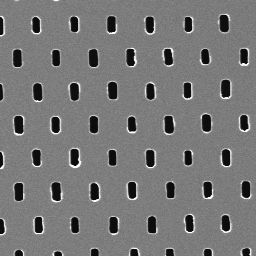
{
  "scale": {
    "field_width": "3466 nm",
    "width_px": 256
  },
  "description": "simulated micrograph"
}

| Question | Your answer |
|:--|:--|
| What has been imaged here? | a regular array of holes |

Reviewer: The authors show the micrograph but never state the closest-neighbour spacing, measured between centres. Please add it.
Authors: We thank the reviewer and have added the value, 502 nm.